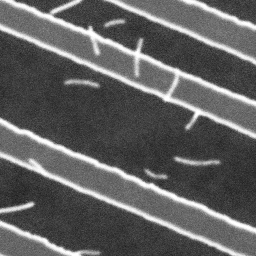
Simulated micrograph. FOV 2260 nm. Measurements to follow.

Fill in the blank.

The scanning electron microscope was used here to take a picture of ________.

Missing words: lines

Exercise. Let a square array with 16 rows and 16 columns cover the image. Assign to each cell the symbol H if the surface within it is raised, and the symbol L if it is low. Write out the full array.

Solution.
HHLLLLLLHHHHHLLL
HHHHLLLLLLHHHHHH
LLHHHHHLLLLLLHHH
LLLLHHHHHLLLLLLH
LLLLLLHHHHHLLLLL
LLLLLLLLLHHHHHLL
LLLLLLLLLLLHHHHH
LLLLLLLLLLLLLHHH
HHLLLLLLLLLLLLLL
HHHHLLLLLLLLLLLL
LLHHHHHLLLLLLLLL
LLLLHHHHHLLLLLLL
LLLLLLLHHHHHLLLL
LLLLLLLLLHHHHHLL
HLLLLLLLLLLHHHHH
HHHHLLLLLLLLLLHH